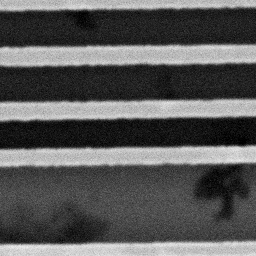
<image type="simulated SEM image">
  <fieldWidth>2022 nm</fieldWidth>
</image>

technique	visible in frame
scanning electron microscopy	lines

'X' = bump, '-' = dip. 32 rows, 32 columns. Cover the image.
XXXXXXXXXXXXXXXXXXXXXXXXXXXXXXXX
--------------------------------
--------------------------------
--------------------------------
--------------------------------
--------------------------------
XXXXXXXXXXXXXXXXXXXXXXXXXXXXXXXX
XXXXXXXXXXXXXXXXXXXXXXXXXXXXXXXX
--------------------------------
--------------------------------
--------------------------------
--------------------------------
--------------------------------
XXXXXXXXXXXXXXXXXXXXXXXXXXXXXXXX
XXXXXXXXXXXXXXXXXXXXXXXXXXXXXX--
--------------------------------
--------------------------------
--------------------------------
----------------------XXXXXXXXXX
XXXXXXXXXXXXXXXXXXXXXXXXXXXXXXXX
XXXXXXXXXXXXXXXX----------------
--------------------------------
--------------------------------
--------------------------------
--------------------------------
--------------------------------
--------------------------------
--------------------------------
--------------------------------
--------------------------------
-------------------XXXXXXXXXXXXX
XXXXXXXXXXXXXXXXXXXXXXXXXXXXXXXX